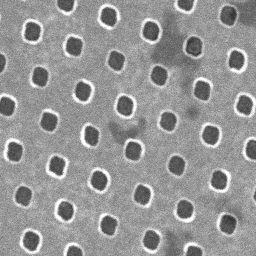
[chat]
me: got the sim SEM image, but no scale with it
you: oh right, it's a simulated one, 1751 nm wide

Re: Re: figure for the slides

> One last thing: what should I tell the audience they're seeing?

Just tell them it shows a regular array of holes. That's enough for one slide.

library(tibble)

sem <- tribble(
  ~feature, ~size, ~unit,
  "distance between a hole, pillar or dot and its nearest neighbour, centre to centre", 44.7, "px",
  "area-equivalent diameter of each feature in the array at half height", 129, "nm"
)